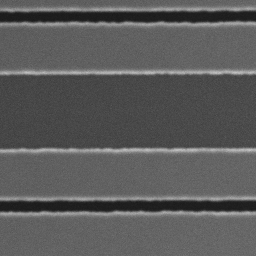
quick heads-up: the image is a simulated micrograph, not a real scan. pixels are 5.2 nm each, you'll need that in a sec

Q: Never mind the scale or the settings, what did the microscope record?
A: lines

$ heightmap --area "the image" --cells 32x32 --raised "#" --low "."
################################
................................
................................
################################
################################
################################
################################
################################
################################
................................
................................
................................
................................
................................
................................
................................
................................
................................
................................
################################
################################
################################
################################
################################
################################
................................
..............#..#..###..#......
################################
################################
################################
################################
################################